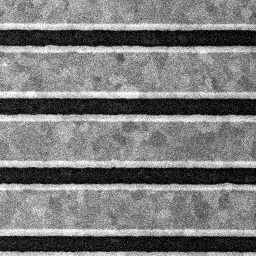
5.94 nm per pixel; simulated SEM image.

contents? one or a few lines or trenches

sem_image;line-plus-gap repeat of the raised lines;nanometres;408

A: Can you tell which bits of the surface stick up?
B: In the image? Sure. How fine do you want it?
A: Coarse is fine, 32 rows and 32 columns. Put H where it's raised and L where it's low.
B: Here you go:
HHHHHHHHHHHHHHHHHHHHHHHHHHHHHHHH
HHHHHHHHHHHHHHHHHHHHHHHHHHHHHHHH
HHHHHHHHHHHHHHHHHHHHHHHHHHHHHHHH
LLLLLLLLLLLLLLLLLLLLLLLLLLLLLLLL
LLLLLLLLLLLLLLLLLLLLLLLLLLLLLLLL
LLLLLLLLLLLLLLLLLLLLLLLLLLLLLLLL
HHHHHHHHHHHHHHHHHHHHHHHHHHHHHHHH
HHHHHHHHHHHHHHHHHHHHHHHHHHHHHHHH
HHHHHHHHHHHHHHHHHHHHHHHHHHHHHHHH
HHHHHHHHHHHHHHHHHHHHHHHHHHHHHHHH
HHHHHHHHHHHHHHHHHHHHHHHHHHHHHHHH
HHHHHHHHHHHHHHHHHHHHHHHHHHHHHHHH
LLLLLLLLLLLLLLLLLLLLLLLLLLLLLLLL
LLLLLLLLLLLLLLLLLLLLLLLLLLLLLLLL
LLLLLLLLLLLLLLLLLLLLLLLLLLLLLLLL
HHHHHHHHHHHHHHHHHHHHHHHHHHHHHHHH
HHHHHHHHHHHHHHHHHHHHHHHHHHHHHHHH
HHHHHHHHHHHHHHHHHHHHHHHHHHHHHHHH
HHHHHHHHHHHHHHHHHHHHHHHHHHHHHHHH
HHHHHHHHHHHHHHHHHHHHHHHHHHHHHHHH
LHHHHHHLHHHHHHLHHHHHHLHHHHHHHHHH
LLLLLLLLLLLLLLLLLLLLLLLLLLLLLLLL
LLLLLLLLLLLLLLLLLLLLLLLLLLLLLLLL
HHHHHHHHHHHHHHHHHHHHHHHHHHHHHHHH
HHHHHHHHHHHHHHHHHHHHHHHHHHHHHHHH
HHHHHHHHHHHHHHHHHHHHHHHHHHHHHHHH
HHHHHHHHHHHHHHHHHHHHHHHHHHHHHHHH
HHHHHHHHHHHHHHHHHHHHHHHHHHHHHHHH
HHHHHHHHHHHHHHHHHHHHHHHHHHHHHHHH
LLLLLLLLLLLLLLLLLLLLLLLLLLLLLLLL
LLLLLLLLLLLLLLLLLLLLLLLLLLLLLLLL
LLLLLLLLLLLLLLLLLLLLLLLLLLLLLLLL